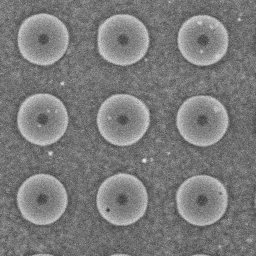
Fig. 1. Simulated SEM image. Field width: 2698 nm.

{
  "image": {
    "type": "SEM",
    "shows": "an array of small figures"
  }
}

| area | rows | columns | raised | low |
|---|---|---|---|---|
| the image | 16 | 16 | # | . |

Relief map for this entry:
................
.###..###...##..
.###..###..###..
..##..###...##..
................
................
.###..###..###..
.###..###..###..
..##..###..###..
................
................
.###..###..###..
.###..###..###..
..##...##..###..
................
................